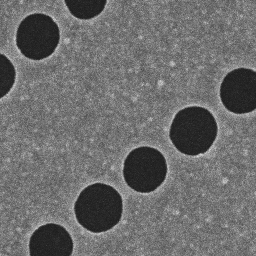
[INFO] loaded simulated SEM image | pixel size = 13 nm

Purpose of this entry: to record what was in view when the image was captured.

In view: holes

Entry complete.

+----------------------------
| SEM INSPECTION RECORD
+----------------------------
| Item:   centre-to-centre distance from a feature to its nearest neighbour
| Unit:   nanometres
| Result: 794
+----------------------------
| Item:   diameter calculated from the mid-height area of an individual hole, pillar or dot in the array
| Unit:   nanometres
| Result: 611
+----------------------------